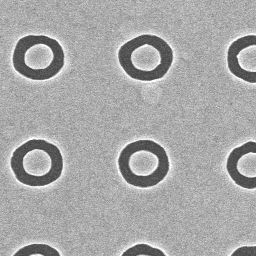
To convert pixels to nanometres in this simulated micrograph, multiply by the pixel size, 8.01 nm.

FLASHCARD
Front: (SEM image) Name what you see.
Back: ring-shaped grooves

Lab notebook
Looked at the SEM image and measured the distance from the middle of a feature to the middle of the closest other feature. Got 848 nm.